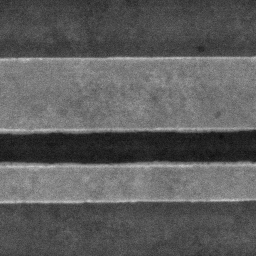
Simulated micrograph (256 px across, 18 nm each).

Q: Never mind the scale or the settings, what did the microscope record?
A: lines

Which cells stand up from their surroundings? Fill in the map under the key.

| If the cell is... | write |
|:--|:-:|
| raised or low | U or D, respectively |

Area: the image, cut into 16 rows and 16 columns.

DDDDDDDDDDDDDDDD
DDDDDDDDDDDDDDDD
DDDDDDDDDDDDDDDD
DDDDDDDDDDDDDDDD
UUUUUUUUUUUUUUUU
UUUUUUUUUUUUUUUU
UUUUUUUUUUUUUUUU
UUUUUUUUUUUUUUUU
DDDDDDDDDDDDDDDD
DDDDDDDDDDDDDDDD
UUUUUUUUUUUUUUUU
UUUUUUUUUUUUUUUU
UUUUUUUUUUUUUUUD
DDDDDDDDDDDDDDDD
DDDDDDDDDDDDDDDD
DDDDDDDDDDDDDDDD